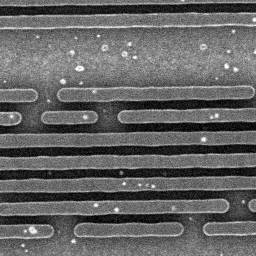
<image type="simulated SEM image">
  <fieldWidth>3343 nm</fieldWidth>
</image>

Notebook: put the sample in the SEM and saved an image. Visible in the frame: groups of lines, slits or small figures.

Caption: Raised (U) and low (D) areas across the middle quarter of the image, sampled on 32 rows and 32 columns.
DDDDDDDDDDDDDDDDDDDDDDDDDDDDDDDD
DDDDDDDDDDDDDDDDDDDDDDDDDDDDDDDD
DDDDDDDDDDDDDDDDDDDDDDDDDDDDDDDD
DDDDDDDDDDDDDDDDDDDDDDDDDDDDDDDD
DDDDDDDDDDDDDDDDDDDDDDDDDDDDDDDD
DDDDDDDDDDDDDDDDDDDDDDDDDDDDDDDD
UUUUUUUUUUUUUUUUUUUUUUUUUUUUUUUU
UUUUUUUUUUUUUUUUUUUUUUUUUUUUUUUU
UUUUUUUUUUUUUUUUUUUUUUUUUUUUUUUU
DDDDDDDDDDDDDDDDDDDDDDDDDDDDDDDD
DDDDDDDDDDDDDDDDDDDDDDDDDDDDDDDD
DDDDDDDDDDDDDDDDDDDDDDDDDDDDDDDD
UUUUUUUUDDDDDDUUUUUUUUUUUUUUUUUU
UUUUUUUUDDDDDDUUUUUUUUUUUUUUUUUU
UUUUUUUUDDDDDDUUUUUUUUUDDUUUUDDD
DDDDDDDDDDDDDDDDDDDDDDDDDDDDDDDD
DDDDDDDDDDDDDDDDDDDDDDDDDDDDDDDD
DDDDDDDDDDUUUUUUUUUUUUUUUUUUUUUU
UUUUUUUUUUUUUUUUUUUUUUUUUUUUUUUU
UUUUUUUUUUUUUUUUUUUUUUUUUUUUUUUU
UUUUUUDDDDDDDDDDDDDDDDDDDDDDDDDD
DDDDDDDDDDDDDDDDDDDDDDDDDDDDDDDD
DDDDDDDDDDDDDDDDDDDDDDDDDDDDDDDD
UUUUUUUUUUUUUUUUUUUUUUUUUUUUUUUU
UUUUUUUUUUUUUUUUUUUUUUUUUUUUUUUU
UUUUUUUUUUUUUUUUUUUUUUUUUUUUUUUU
DDDDDDDDDDDDDDDDDDDDDDDDDDDDDDDD
DDDDDDDDDDDDDDDDDDDDDDDDDDDDDDDD
DDDDDDDDDDDDDDDDDDDDDDDDDDDDDDDD
UUUUUUUUUUUUUUUUUUUUUUUUUUUUUUUU
UUUUUUUUUUUUUUUUUUUUUUUUUUUUUUUU
UUUUUUUUUUUUUUUUUUUDDDDDDDDDDDDD